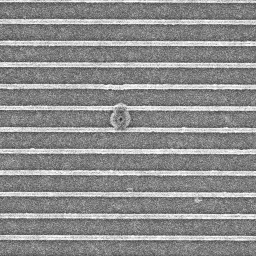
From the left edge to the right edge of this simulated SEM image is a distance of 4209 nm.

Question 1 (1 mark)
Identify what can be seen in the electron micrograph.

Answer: parallel lines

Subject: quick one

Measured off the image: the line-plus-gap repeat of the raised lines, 355 nanometers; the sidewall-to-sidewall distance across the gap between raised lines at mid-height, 0.288 micrometres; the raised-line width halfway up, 0.0657 um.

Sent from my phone